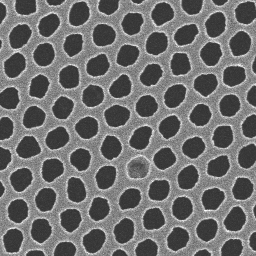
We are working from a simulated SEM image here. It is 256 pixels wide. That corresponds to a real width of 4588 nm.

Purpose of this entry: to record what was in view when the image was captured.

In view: a regular array of holes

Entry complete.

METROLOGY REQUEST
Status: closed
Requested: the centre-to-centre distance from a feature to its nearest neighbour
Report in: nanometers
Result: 541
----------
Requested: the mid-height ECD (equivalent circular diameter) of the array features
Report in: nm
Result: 399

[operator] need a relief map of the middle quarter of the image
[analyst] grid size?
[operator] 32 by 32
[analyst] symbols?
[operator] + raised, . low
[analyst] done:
+..+++.....+++..++++....+++.....
....+......+++++++++.....++.....
....++....+++++++++......++...++
....++++++++++..+++.....++++++++
....++++++++.....++....+++++++++
...+++...+++.....+++.++++++...++
+++++.....+......+++++++++.....+
+++++.....++....+++++++++.....++
.++++.....+++.+++++....++.....++
..+++.....++++++++.....++....+++
..+++...++++..++++......++..++++
..+++++++++.....++.....+++++++++
..++++++++.......++...++++++++++
.++++..+++......+++++++++...+++.
+++.....+++.....++++++++.....+++
+++......++...++++++++++.....+++
.++.....++++++++++....++.....+++
.+++....+++++++++.....++....++++
.+++...+++...++++....++++.++++++
.+++++++++....++.....+++++++++..
+++++++++.....+++....+++++++++..
+++...+++.....++++++++++...++...
++.....+++....+++++++++.....++..
++.....+++...+++++++++......+++.
++.....+++++++++++++++......++++
++....++++..+++++++++++....++++.
+++..++++....++++++++++++++++...
++++++++.....++++++++++++++++...
+..+++++.....+++++++++++++++....
+....+++.....+++++++++....+++...
+....+++....+++++++++.....+++...
+....++++++++++....++.....++++++